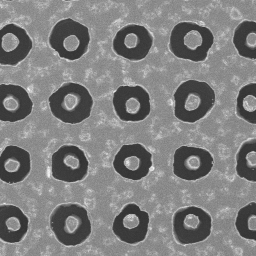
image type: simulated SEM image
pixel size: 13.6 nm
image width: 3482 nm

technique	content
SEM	a regular array of ring-shaped grooves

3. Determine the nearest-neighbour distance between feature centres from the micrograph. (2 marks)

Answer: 808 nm